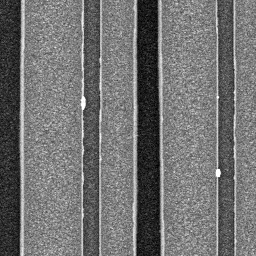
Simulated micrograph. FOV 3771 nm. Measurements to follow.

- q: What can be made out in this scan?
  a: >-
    lines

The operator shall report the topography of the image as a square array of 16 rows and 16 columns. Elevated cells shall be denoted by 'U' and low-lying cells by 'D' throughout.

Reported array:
DUUUUUUUDDUUUUUU
DUUUUUUUDDUUUUUU
DUUUUUUUDDUUUUUU
DUUUUUUUDDUUUUUU
DUUUUUUUDDUUUUUU
DUUUUUUUDDUUUUUU
DUUUUUUUDDUUUUUU
DUUUUUUUDDUUUUUU
DUUUUUUUDDUUUUUU
DUUUUUUUDDUUUUUU
DUUUUUUUDDUUUUUU
DUUUUUUUDDUUUUUU
DUUUUUUUDDUUUUUU
DUUUUUUUDDUUUUUU
DUUUUUUUDDUUUUUU
DUUUUUUUDDUUUUUU